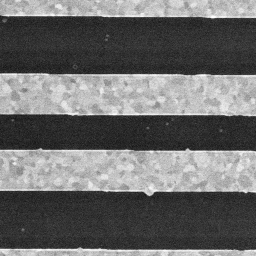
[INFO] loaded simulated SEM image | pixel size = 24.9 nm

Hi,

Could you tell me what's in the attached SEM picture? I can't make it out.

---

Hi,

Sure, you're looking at lines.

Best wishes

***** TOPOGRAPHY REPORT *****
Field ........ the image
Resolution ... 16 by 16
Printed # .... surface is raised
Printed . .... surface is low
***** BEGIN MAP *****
################
................
................
................
................
################
################
................
................
################
################
################
................
................
................
................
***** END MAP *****